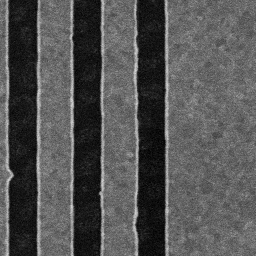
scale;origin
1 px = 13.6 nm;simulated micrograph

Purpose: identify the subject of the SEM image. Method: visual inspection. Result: one or a few lines or trenches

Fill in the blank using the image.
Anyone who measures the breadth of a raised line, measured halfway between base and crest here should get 33.6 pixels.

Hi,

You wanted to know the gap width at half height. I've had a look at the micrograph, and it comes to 417 nm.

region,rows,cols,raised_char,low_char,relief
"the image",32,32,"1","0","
10000111100001111000011111111111
10000111100001111000011111111111
10000111100001111000011111111111
10000111100001111000011111111111
10000111100001111000011111111111
10000111100001111000011111111111
10000111100001111000011111111111
10000111100001111000011111111111
10000111100001111000011111111111
10000111100001111000011111111111
10000111100001111000011111111111
10000111100001111000011111111111
10000111100001111000011111111111
10000111100001111000011111111111
10000111100001111000011111111111
10000111100001111000011111111111
10000111100001111000011111111111
10000111100001111000011111111111
10000111100001111000011111111111
10000111100001111000011111111111
10000111100001111000011111111111
10000111100001111000011111111111
10000111100001111000011111111111
10000111100001111000011111111111
10000111100001111000011111111111
10000111100001111000011111111111
10000111100001111000011111111111
10000111100001111000011111111111
10000111100001111000011111111111
10000111100001111000011111111111
10000111100001111000011111111111
10000111100001111000011111111111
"